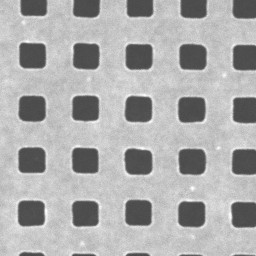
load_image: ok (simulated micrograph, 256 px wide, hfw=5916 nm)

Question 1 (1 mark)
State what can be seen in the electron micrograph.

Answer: a regular array of holes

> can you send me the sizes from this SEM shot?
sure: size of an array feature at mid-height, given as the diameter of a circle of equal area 687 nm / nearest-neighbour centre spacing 1210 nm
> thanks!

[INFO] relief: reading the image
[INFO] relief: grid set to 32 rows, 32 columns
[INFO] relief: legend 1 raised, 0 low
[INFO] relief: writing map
11000011100001110001110000111000
11100011100011110001110000111000
11111111111111111111111111111111
11111111111111111111111111111111
11111111111111111111111111111111
11100111100011110011111001111101
11000011100001110001110000111000
11000011100001110001110000111000
11100111100011110001111000111000
11111111111111111111111111111111
11111111111111111111111111111111
11111111111111111111111111111111
11000011100011110001110000111000
11000011100011110001110000111000
11000011100011110001110000111000
11111111111111111111111111111111
11111111111111111111111111111111
11111111111111111111111111111111
11100111110111111111111011111111
11000011100011100001110000111000
11000011100011100001110000111000
11100111100011110001111001111000
11111111111111111111111111111111
11111111111111111111111111111111
11111111111111111111111111111111
11000111100011110001110000111000
11000011100011110001110000111000
11000011100011110001110000111000
11111111111111111111111101111101
11111111111111111111111111111111
11111111111111111111111111111111
11111111111111111111111111111111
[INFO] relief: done